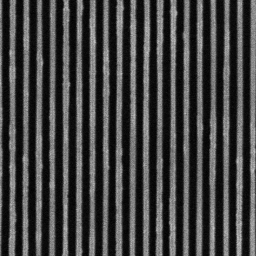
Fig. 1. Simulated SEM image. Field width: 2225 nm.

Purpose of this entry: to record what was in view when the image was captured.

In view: parallel lines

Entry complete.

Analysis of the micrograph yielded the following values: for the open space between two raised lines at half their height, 72.8 nm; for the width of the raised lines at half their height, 48.9 nm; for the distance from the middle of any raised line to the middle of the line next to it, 116 nanometres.